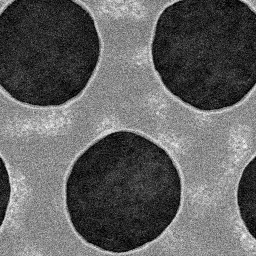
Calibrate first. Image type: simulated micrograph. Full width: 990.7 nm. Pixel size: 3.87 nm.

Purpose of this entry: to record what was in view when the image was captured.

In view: holes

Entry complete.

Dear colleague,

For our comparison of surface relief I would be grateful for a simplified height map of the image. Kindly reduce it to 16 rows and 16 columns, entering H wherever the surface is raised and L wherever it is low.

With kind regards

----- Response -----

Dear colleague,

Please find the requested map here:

LLLLLHHHHHLLLLLL
LLLLLLHHHHLLLLLL
LLLLLLHHHHLLLLLL
LLLLLLHHHLLLLLLL
LLLLLLHHHHLLLLLL
LLLLLHHHHHLLLLLL
HHLLHHHHHHHHLLLH
HHHHHHHHHHHHHHHH
HHHHHHHLLHHHHHHH
HHHHHLLLLLHHHHHH
HHHHLLLLLLLHHHHL
LHHHLLLLLLLHHHHL
LHHHLLLLLLLHHHHL
HHHHLLLLLLLHHHHL
HHHHHLLLLLHHHHHH
HHHHHHLLLHHHHHHH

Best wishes